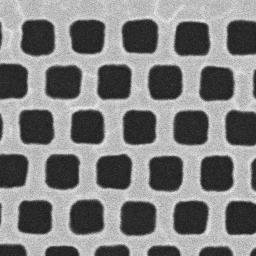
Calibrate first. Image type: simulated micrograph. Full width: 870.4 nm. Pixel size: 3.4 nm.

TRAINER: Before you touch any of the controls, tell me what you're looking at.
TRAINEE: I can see a regular array of holes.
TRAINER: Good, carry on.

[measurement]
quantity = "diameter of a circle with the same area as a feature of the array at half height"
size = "126 nm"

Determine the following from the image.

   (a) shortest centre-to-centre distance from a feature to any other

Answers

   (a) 173 nanometres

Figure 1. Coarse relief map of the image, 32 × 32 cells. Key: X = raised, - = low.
XXXXXXXXXXXXXXXXXXXXXXXXXXXXXXXX
XXXXXXXXXXXXXXXXXXXXXXXXXXXXXXXX
XXXX-XXXXX--XXXXX--XXXXXXXXXXXXX
XXX----XX----XX-----XX----XX----
XXX----XX----XX-----XX----XX----
XXX----XX----XX-----XX----XX----
XXX---XXX---XXXX---XXX----XXX---
XXXXXXXXXXXXXXXXXXXXXXXXXXXXXXXX
---XXX----XXX---XXX---XXXX--XXXX
----XX----XX----XXX----XX----XXX
----XX----XX----XX-----XX----XXX
---XXX----XX----XXX----XX----XXX
XXXXXXXXXXXXXXXXXXXXXXXXXX--XXXX
XXXXXXXXXXXXXXXXXXXXXXXXXXXXXXXX
XX-----XX----XX----XXX----XX----
XX-----XX----XX-----XX----XX----
XX-----XX----XX-----XX----XX----
XXX---XXX----XXX---XXX----XX----
XXXXXXXXXXXXXXXXXXXXXXXXXXXXXXXX
---XXX---XXXX---XXXX--XXXX--XXXX
----XX----XX----XXX----XX----XX-
---XXX----XX----XXX----XX----XX-
---XXX----XX----XXX----XX----XX-
XXXXXX---XXXX---XXX---XXX----XXX
XXXXXXXXXXXXXXXXXXXXXXXXXXXXXXXX
XXX---XXX----XXX---XXX----XXX---
XX-----XX----XX----XXX----XX----
XX----XXX----XX----XXX----XX----
XX----XXX----XX----XXX----XX----
XXXXXXXXXXXXXXXX--XXXXXXXXXXXXXX
-XXXXXXXXXXXXXXXXXXXXXXXXXXXXXXX
---XXX----XX----XXX---XXX----XX-